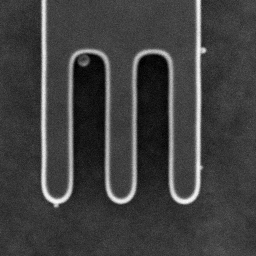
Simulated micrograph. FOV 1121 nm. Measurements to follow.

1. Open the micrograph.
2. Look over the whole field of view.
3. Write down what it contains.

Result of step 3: groups of lines, slits or small figures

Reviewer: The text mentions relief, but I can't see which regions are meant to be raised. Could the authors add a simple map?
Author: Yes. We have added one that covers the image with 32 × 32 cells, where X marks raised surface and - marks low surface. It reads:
-----XXXXXXXXXXXXXXXXXXXX-------
-----XXXXXXXXXXXXXXXXXXXX-------
-----XXXXXXXXXXXXXXXXXXXX-------
-----XXXXXXXXXXXXXXXXXXXX-------
-----XXXXXXXXXXXXXXXXXXXX-------
-----XXXXXXXXXXXXXXXXXXXX-------
-----XXXXXXXXXXXXXXXXXXXX-------
-----XXXX----XXXX----XXXX-------
-----XXXX----XXXX----XXXX-------
-----XXXX----XXXX----XXXX-------
-----XXXX----XXXX----XXXX-------
-----XXXX----XXXX----XXXX-------
-----XXXX----XXXX----XXXX-------
-----XXXX----XXXX----XXXX-------
-----XXXX----XXXX----XXXX-------
-----XXXX----XXXX----XXXX-------
-----XXXX----XXXX----XXXX-------
-----XXXX----XXXX----XXXX-------
-----XXXX----XXXX----XXXX-------
-----XXXX----XXXX----XXXX-------
-----XXXX----XXXX----XXXX-------
-----XXXX----XXXX----XXXX-------
-----XXXX----XXXX----XXXX-------
-----XXXX----XXXX----XXXX-------
------XX------XX------XX--------
--------------------------------
--------------------------------
--------------------------------
--------------------------------
--------------------------------
--------------------------------
--------------------------------